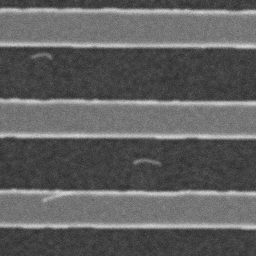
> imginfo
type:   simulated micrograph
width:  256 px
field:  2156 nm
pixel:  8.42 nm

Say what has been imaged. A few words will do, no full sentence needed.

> lines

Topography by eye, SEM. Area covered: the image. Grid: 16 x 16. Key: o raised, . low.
................
oooooooooooooooo
oooooooooooooooo
................
................
................
oooooooooooooooo
oooooooooooooooo
oooooooooooooooo
................
................
................
oooooooooooooooo
oooooooooooooooo
................
................